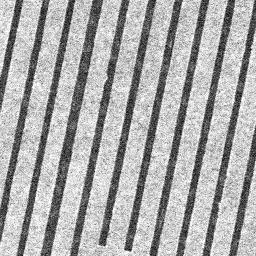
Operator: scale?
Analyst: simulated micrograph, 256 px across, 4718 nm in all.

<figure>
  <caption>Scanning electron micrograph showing parallel lines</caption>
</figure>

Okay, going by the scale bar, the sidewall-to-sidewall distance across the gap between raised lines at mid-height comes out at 154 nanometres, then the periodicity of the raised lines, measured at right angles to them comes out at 480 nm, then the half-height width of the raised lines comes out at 0.325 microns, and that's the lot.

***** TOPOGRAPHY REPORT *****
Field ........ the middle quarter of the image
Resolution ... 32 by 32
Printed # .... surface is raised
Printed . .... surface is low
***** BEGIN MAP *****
####...####..#####..####..#####.
###...#####..####...####..#####.
###...#####..####..#####..####..
###...#####..####..#####..####..
###...####..#####..####...####..
###..#####..#####..####..#####..
##...#####..####...####..#####..
##...####...####..#####..####...
##...####...####..#####..####..#
##...####..#####..####...####..#
##..#####..#####..####..#####..#
#...#####..####...####..#####..#
#...####...####..#####..####...#
#...####...####..#####..####..##
#...####..#####..####...####..##
#..#####..####...####..#####..##
...#####..####...####..#####..##
...####...####..#####..####...##
...####..#####..#####..####..###
...####..#####..####...####..###
..#####..####...####..#####..###
..#####..####...####..#####..###
..####...####..#####..####...###
..####..#####..#####..####..####
..####..#####..####...####..####
.#####..####...####..#####..####
.#####..####..#####..#####..####
.####...####..#####..####...####
.####..#####..####...####..#####
.####..#####..####...####..#####
#####..####...####..#####..####.
#####..####..#####..#####..####.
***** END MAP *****